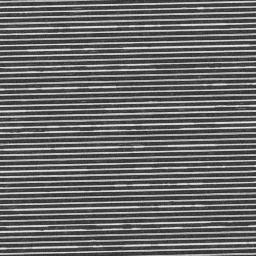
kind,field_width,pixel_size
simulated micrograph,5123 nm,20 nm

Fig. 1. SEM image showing parallel lines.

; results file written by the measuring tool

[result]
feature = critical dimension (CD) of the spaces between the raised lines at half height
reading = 0.08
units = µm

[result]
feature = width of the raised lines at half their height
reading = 32.5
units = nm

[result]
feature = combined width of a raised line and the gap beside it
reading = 110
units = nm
